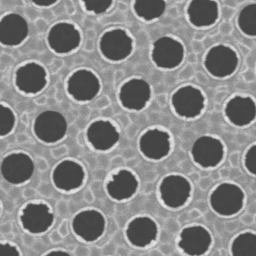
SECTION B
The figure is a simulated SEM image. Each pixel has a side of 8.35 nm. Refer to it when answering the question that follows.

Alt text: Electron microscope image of a regular array of holes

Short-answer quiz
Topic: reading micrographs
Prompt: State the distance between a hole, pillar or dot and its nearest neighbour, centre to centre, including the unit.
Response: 431 nanometers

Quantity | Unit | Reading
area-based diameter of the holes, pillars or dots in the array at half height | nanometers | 263